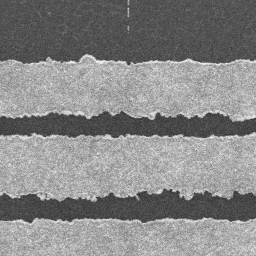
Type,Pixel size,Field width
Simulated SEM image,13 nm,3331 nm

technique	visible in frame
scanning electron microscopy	one or a few lines or trenches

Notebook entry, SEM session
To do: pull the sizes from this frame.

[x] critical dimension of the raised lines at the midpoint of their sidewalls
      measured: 720 nanometers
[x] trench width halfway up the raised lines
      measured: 0.299 µm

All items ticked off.